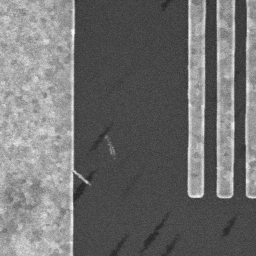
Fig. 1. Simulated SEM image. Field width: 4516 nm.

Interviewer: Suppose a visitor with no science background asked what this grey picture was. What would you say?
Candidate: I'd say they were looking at wiring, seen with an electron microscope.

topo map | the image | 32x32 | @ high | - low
@@@@@@@@@---------------@@-@@--@
@@@@@@@@@---------------@@-@@--@
@@@@@@@@@---------------@@-@@--@
@@@@@@@@@---------------@@-@@--@
@@@@@@@@@---------------@@-@@--@
@@@@@@@@@---------------@@-@@--@
@@@@@@@@@---------------@@-@@--@
@@@@@@@@@---------------@@-@@--@
@@@@@@@@@---------------@@-@@--@
@@@@@@@@@---------------@@-@@--@
@@@@@@@@@---------------@@-@@--@
@@@@@@@@@---------------@@-@@--@
@@@@@@@@@---------------@@-@@--@
@@@@@@@@@---------------@@-@@--@
@@@@@@@@@---------------@--@@--@
@@@@@@@@@---------------@--@@--@
@@@@@@@@@---------------@--@@--@
@@@@@@@@@---------------@--@@--@
@@@@@@@@@---------------@--@@--@
@@@@@@@@@---------------@--@@--@
@@@@@@@@@---------------@--@@--@
@@@@@@@@@---------------@--@@--@
@@@@@@@@@---------------@--@@--@
@@@@@@@@@---------------@--@@--@
@@@@@@@@@---------------@--@@--@
@@@@@@@@@-----------------------
@@@@@@@@@-----------------------
@@@@@@@@@-----------------------
@@@@@@@@@-----------------------
@@@@@@@@@-----------------------
@@@@@@@@@-----------------------
@@@@@@@@@-----------------------